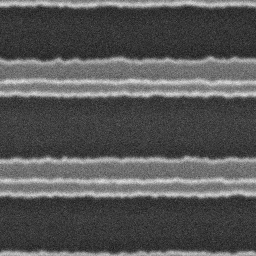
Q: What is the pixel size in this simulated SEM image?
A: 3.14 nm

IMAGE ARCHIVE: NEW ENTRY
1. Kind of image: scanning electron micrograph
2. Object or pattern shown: lines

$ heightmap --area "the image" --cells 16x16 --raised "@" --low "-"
----------------
----------------
----------------
----------------
@@@@@@@@@@@@@@@@
@@@@@@@@@@@@@@@@
----------------
----------------
----------------
----------------
@@@@@@@@@@@@@@@@
@@@@@@@@@@@@@@@@
----------------
----------------
----------------
----------------